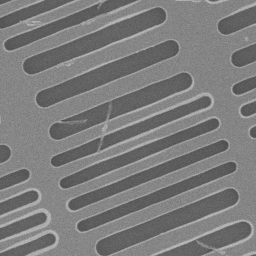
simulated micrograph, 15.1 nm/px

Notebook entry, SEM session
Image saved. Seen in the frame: groups of lines, slits or small figures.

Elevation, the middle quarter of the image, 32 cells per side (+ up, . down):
+++++++++.............++++++++++
+++++++............+++++++++++++
+++++............+++++++++++...+
++............++++++++++++......
............++++++++++++........
.........++++++++++++...........
.......++++++++++++............+
....++++++++++++............++++
..+++++++++++.............++++++
++++++++++.............+++++++..
++++++++.............+++++++....
++++++............++++++++......
+++............++++++++.........
+............+++++++.........+++
..........++++++++.........+++++
.......++++++++..........+++++++
.....++++++++.........++++++++..
...++++++++.........+++++++.....
++++++++..........+++++++.......
++++++.........+++++++........++
++++........+++++++........+++++
+.........+++++++........+++++++
........++++++.........+++++++..
.....+++++++.........+++++++....
..+++++++.........+++++++.......
++++++.........++++++++........+
+++++........+++++++.........+++
++.........+++++++........++++++
........+++++++.........+++++++.
......+++++++........++++++++...
...+++++++.........+++++++......
+++++++.........+++++++........+